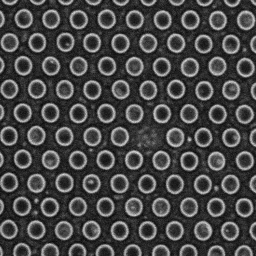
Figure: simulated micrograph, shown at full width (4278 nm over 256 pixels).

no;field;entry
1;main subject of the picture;a regular array of raised bodies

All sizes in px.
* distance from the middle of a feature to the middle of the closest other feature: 26.8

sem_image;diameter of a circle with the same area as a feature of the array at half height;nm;290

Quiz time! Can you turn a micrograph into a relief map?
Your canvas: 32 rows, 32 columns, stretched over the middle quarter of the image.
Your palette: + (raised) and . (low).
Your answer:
..++++...++++...++++...++++...++
..+++....++++...++++...+++....++
...++.....++.....++.....++....++
................................
+.....++.....++............++...
++...++++...++++...++++...++++..
++...++++...++++...++++...++++..
++...++++....+++...++++...++++..
+.....++............++.....++...
................................
..+++....+++.....+......+.....++
..+++....++++...++++...+++...+++
..++++...++++...++++...+++...+++
..+++....+++....+++....+++...+++
...+....................+......+
................................
+.....++.....++............++...
++...++++...++++..........++++..
++...++++...++++..........++++..
++....+++...++++..........++++..
...........................++...
................................
..+++....+++....+++....+++....++
..++++..++++...++++...++++...+++
..++++..++++...++++...++++...+++
..+++....+++....+++....+++....++
................................
................................
++...+++....+++....+++....+++...
++...++++...++++...++++...++++..
++...++++...++++...++++...++++..
+....+++....+++....+++....+++...